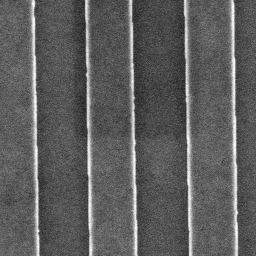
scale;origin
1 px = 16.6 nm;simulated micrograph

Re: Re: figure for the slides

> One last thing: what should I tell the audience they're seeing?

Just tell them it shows lines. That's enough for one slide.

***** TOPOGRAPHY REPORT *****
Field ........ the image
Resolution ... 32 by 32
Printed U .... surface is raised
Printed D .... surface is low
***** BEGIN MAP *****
UUUUDDDDDDDUUUUUDDDDDDDUUUUUUDDD
UUUUDDDDDDDUUUUUDDDDDDDUUUUUUDDD
UUUUDDDDDDDUUUUUDDDDDDDUUUUUUDDD
UUUUDDDDDDDUUUUUUDDDDDDUUUUUUDDD
UUUUDDDDDDDUUUUUUDDDDDDUUUUUUDDD
UUUUDDDDDDDUUUUUUDDDDDDUUUUUUDDD
UUUUDDDDDDDUUUUUUDDDDDDUUUUUUDDD
UUUUDDDDDDDUUUUUUDDDDDDUUUUUUDDD
UUUUDDDDDDDUUUUUUDDDDDDUUUUUUDDD
UUUUDDDDDDDUUUUUUDDDDDDUUUUUUDDD
UUUUDDDDDDDUUUUUUDDDDDDUUUUUUDDD
UUUUDDDDDDDUUUUUUDDDDDDUUUUUUDDD
UUUUDDDDDDDUUUUUUDDDDDDUUUUUUDDD
UUUUDDDDDDDUUUUUUDDDDDDUUUUUUDDD
UUUUDDDDDDDUUUUUUDDDDDDUUUUUUDDD
UUUUDDDDDDDUUUUUUDDDDDDUUUUUUDDD
UUUUDDDDDDDUUUUUUDDDDDDUUUUUUDDD
UUUUDDDDDDDUUUUUUDDDDDDUUUUUUDDD
UUUUUDDDDDDUUUUUUDDDDDDDUUUUUDDD
UUUUUDDDDDDUUUUUUDDDDDDDUUUUUDDD
UUUUUDDDDDDUUUUUUDDDDDDDUUUUUUDD
UUUUUDDDDDDUUUUUUDDDDDDDUUUUUUDD
UUUUUDDDDDDUUUUUUDDDDDDDUUUUUUDD
UUUUUDDDDDDUUUUUUDDDDDDDUUUUUUDD
UUUUUDDDDDDUUUUUUDDDDDDDUUUUUUDD
UUUUUDDDDDDUUUUUUDDDDDDDUUUUUUDD
UUUUUDDDDDDUUUUUUDDDDDDDUUUUUUDD
UUUUUDDDDDDUUUUUUDDDDDDDUUUUUUDD
UUUUUDDDDDDUUUUUUDDDDDDDUUUUUUDD
UUUUUDDDDDDUUUUUUDDDDDDDUUUUUUDD
UUUUUDDDDDDUUUUUUDDDDDDDUUUUUUDD
UUUUUDDDDDDUUUUUUDDDDDDDUUUUUUDD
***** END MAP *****